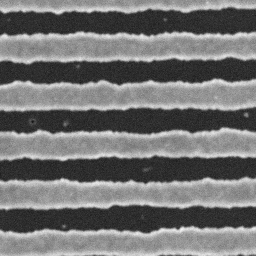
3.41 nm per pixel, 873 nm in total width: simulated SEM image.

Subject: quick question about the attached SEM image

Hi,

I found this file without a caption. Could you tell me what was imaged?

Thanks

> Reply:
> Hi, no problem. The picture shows lines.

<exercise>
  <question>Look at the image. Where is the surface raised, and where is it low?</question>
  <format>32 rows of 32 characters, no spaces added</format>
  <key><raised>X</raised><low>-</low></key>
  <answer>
XXXXXXXXXXXXXXXXXXXXXXXXXXXXXXXX
------XX-------XX---------------
--------------------------------
--------------------------------
X-XXXXXXXXXXXXXXXX-XXXXXXXXXXXXX
XXXXXXXXXXXXXXXXXXXXXXXXXXXXXXXX
XXXXXXXXXXXXXXXXXXXXXXXXXXXXXXXX
XXXXXXXXXXXXXX-XXXX-------------
--------------------------------
--------------------------------
-XXX---XX--XXX---XXX-XXX-XXXXXXX
XXXXXXXXXXXXXXXXXXXXXXXXXXXXXXXX
XXXXXXXXXXXXXXXXXXXXXXXXXXXXXXXX
XXXXXXXXXXXXXXXX----XX---XXXXX--
--------------------------------
--------------------------------
---------------------XX----XXXX-
XXXXXXXXXXXXXXXXXXXXXXXXXXXXXXXX
XXXXXXXXXXXXXXXXXXXXXXXXXXXXXXXX
XXXXXXXXXXXXXXXXXXX--XXXXXXXX-XX
--------------------------------
--------------------------------
-------------------------XX---XX
XXXXXXXXXXXXXXXXXXXXXXXXXXXXXXXX
XXXXXXXXXXXXXXXXXXXXXXXXXXXXXXXX
XXXXXXXXXXXXXXXXXXXXXXXXXXXXXXXX
--------------------------------
--------------------------------
-----------------------X--------
XXXXXXXXXXXXXXXXXXXXXXXXXXXXXXXX
XXXXXXXXXXXXXXXXXXXXXXXXXXXXXXXX
XXXXXXXXXXXXXXXXXXXXXXXXXXXXXXXX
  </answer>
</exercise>